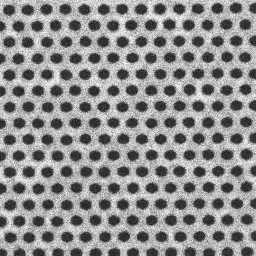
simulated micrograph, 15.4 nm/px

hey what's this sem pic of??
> a regular array of holes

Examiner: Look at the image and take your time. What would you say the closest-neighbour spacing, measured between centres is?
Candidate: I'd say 284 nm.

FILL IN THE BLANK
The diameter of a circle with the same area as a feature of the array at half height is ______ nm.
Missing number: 181